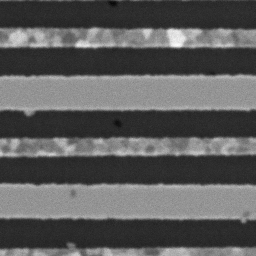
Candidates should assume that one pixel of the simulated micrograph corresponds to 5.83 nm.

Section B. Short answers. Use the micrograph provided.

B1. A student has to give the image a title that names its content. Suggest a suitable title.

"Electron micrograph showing lines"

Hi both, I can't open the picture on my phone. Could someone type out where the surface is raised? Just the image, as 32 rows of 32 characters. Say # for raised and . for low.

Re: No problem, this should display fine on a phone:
................................
................................
................................
................................
################################
################################
................................
................................
................................
...............#..#..#..#..####.
################################
################################
################################
################################
................................
................................
................................
################################
################################
##..............................
................................
................................
................................
################################
################################
################################
################################
................................
................................
................................
................................
################################